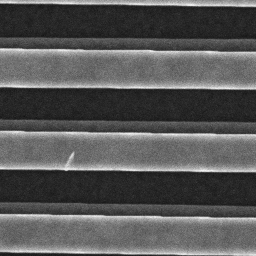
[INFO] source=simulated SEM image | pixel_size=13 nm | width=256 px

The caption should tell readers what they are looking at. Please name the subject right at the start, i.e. lines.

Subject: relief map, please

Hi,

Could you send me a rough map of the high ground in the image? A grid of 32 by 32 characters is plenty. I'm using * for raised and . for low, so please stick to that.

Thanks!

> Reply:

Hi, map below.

...............*****************
................................
................................
................................
................................
********************************
********************************
********************************
********************************
********************************
********************************
................................
................................
................................
................................
********************************
********************************
********************************
********************************
********************************
********************************
................................
................................
................................
................................
**********......................
********************************
********************************
********************************
********************************
********************************
.*******************************